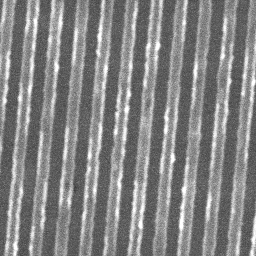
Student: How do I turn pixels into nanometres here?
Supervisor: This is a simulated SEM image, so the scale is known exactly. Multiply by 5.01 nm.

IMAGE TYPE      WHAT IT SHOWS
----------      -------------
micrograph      parallel lines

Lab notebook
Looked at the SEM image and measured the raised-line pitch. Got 123 nm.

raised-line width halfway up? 56.1 nm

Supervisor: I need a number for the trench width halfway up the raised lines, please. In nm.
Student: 65.5